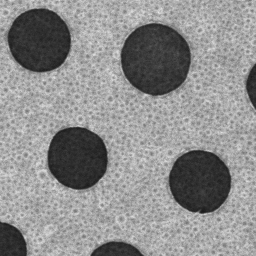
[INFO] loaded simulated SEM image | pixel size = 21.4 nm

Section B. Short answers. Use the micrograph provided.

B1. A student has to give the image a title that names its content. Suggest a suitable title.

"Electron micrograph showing holes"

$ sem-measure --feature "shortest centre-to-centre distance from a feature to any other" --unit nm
2580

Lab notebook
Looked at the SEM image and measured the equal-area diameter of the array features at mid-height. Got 1360 nm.